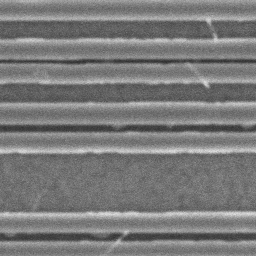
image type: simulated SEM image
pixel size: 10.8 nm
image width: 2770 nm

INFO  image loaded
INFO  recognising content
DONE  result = lines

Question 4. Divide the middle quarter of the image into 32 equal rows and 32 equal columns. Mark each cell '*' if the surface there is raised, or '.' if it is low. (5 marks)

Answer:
********************************
********************************
********************************
********************************
********************************
................................
................................
................................
................................
................................
********************************
********************************
********************************
********************************
********************************
................................
................................
********************************
********************************
********************************
********************************
********************************
................................
................................
................................
................................
................................
................................
................................
................................
................................
................................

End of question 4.